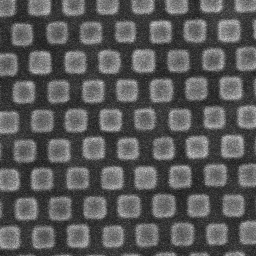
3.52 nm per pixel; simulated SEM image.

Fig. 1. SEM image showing a regular array of raised bodies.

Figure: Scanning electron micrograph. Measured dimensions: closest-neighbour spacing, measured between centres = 117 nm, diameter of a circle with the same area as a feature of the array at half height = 0.0779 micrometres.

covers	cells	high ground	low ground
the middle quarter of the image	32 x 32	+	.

+++++....+++++....++++....+++++.
+++++....+++++....++++.....+++..
................................
................................
......+++.....++++....+++++....+
+....+++++...+++++....+++++....+
+....+++++...+++++....+++++....+
+....+++++...+++++....+++++....+
+....+++++...+++++....+++++....+
................................
................................
...................+++........+.
.++++....+++++....++++.....++++.
.++++....+++++....++++.....++++.
.++++....+++++....++++.....++++.
.++++....+++++....++++.....++++.
.++++...........................
................................
................................
+....+++++....++++....+++++....+
+....+++++....++++....+++++....+
+....+++++....++++.....++++....+
+....+++++....++++.....++++....+
+.............+........+++......
................................
................................
.++++.....++++....+++++....++++.
.+++++....++++....+++++....+++++
.+++++...+++++....+++++....+++++
.+++++....++++....+++++....+++++
.+++++....++++....++++.....++++.
................................